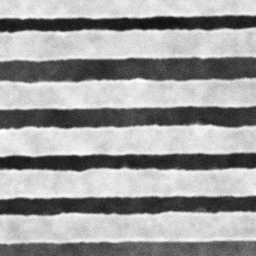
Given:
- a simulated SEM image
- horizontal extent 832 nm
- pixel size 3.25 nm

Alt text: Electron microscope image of lines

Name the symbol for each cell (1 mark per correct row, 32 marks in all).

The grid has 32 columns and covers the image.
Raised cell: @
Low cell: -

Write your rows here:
@@@@@@@@@@@@@@@@@@@@@@@@@@@@@@@@
@@@@@@@@@@@@@@@@@@@@@@@@@@@@@@@@
--------------------------------
-------------------------------@
@@@@@@@@@@@@@@@@@@@@@@@@@@@@@@@@
@@@@@@@@@@@@@@@@@@@@@@@@@@@@@@@@
@@@@@@@@@@@@@@@@@@@@@@@@@@@@@@@@
@@-@@@@-------------------------
--------------------------------
--------------------------------
@@@@@@@@@@@@@@@@@@@@@@@@@@@@@@@@
@@@@@@@@@@@@@@@@@@@@@@@@@@@@@@@@
@@@@@@@@@@@@@@@@@@@@@@@@@@@@@@@@
@@@@@@@@@@@@@-@@@@--------------
--------------------------------
--------------------------------
@@@@@@@@@@@@@@@@@@@@@@@@@@@@@@@@
@@@@@@@@@@@@@@@@@@@@@@@@@@@@@@@@
@@@@@@@@@@@@@@@@@@@@@@@@@@@@@@@@
@--@@---------------------------
--------------------------------
@@@@@@@@@@@@@@@@@@@@@@@@@@@@@@@@
@@@@@@@@@@@@@@@@@@@@@@@@@@@@@@@@
@@@@@@@@@@@@@@@@@@@@@@@@@@@@@@@@
@@@@@@@@@@@@@@@@@@@@@@-@@@@@-@@-
--------------------------------
---------------------@-------@@-
@@@@@@@@@@@@@@@@@@@@@@@@@@@@@@@@
@@@@@@@@@@@@@@@@@@@@@@@@@@@@@@@@
@@@@@@@@@@@@@@@@@@@@@@@@@@@@@@@@
--------------------------------
--------------------------------